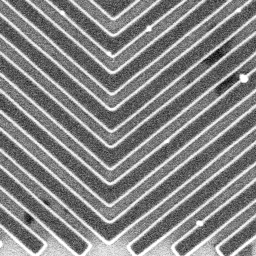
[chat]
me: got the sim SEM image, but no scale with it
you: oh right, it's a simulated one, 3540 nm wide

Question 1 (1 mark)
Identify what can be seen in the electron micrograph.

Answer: groups of lines, slits or small figures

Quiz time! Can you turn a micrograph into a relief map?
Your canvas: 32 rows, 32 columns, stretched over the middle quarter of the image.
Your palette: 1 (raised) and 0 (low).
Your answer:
00011111110000011111100000111111
00001111111001111111000001111111
10000011111111111110000111111100
11000001111111111000001111111000
11110000111111110000011111110000
11111000011111100001111111000001
11111100001111000011111110000011
01111110000000000111111100000111
00111111000000001111111000011111
00011111100000011111110000111111
00001111110001111111100001111111
10000111111111111110000011111110
11000011111111111100001111111000
11100000111111111000011111110000
11110000011111100001111111100001
11111000001111000011111110000011
11111110000110000111111100000111
01111111000000001111111000001111
00111111100000011111110000111111
00011111110000111111100001111111
00000111111011111110000011111110
10000011111111111100000111111000
11100001111111111000011111110000
11110000111111110000111111100001
11111000011111000001111111000011
11111100001110000111111110000111
01111110000000001111111000001111
01111111000000011111110000111111
00011111100000111111100001111111
00001111111011111110000011111110
10000111111111111100000111111100
11000011111111111000011111110000